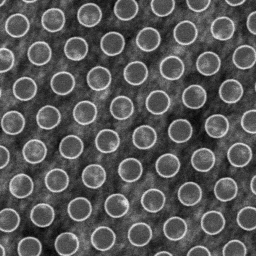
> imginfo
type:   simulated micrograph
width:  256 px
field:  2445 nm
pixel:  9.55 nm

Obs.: a regular array of raised bodies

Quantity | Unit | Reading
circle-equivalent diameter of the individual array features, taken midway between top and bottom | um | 0.22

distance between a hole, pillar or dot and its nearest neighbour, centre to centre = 0.343 micrometres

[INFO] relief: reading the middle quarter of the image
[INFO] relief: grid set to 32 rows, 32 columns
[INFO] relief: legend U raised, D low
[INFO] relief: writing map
DDDDDDDDDDDDDDDDUUUUDDDDUUUUUUDD
DDDDDDDUUUUDDDDUUUUUUDDDUUUUUUDD
UDDDDDUUUUUDDDDUUUUUUDDDDUUUUDDD
UUDDDDUUUUUUDDDUUUUUDDDDDDUUUDDD
UUDDDDUUUUUDDDDDUUUDDDDDDDDDDDDD
UUDDDDUUUUUDDDDDDDDDDDDDDDDDDDDD
UUDDDDDDDDDDDDDDDDDDDDDDDDDDDDUU
DDDDDDDDDDDDDDDDDDDDDDUUUDDDDDUU
DDDDDDDDDDDDDUUUDDDDDUUUUUDDDDUU
DDDDDUDDDDDDUUUUUDDDDUUUUUDDDDUU
DDDUUUUUDDDDUUUDUDDDDUUUUUDDDDDU
DDDUUUUUDDDDUUUUUDDDDUUUUDDDDDDD
DDDUUUUUDDDDUUUUUDDDDDDDDDDDDDDD
DDDUUUUUDDDDDUUDDDDDDDDDDDDDDDDD
DDDDUUUDDDDDDDDDDDDDDDDDDDDUUUUD
DDDDDDDDDDDDDDDDDDDDDDDDDDDUUUUU
DDDDDDDDDDDDDDDDDDUUUUDDDDUUUUUU
DDDDDDDDDUUUUDDDDUUUUUUDDDUUUUUU
UUUDDDDDUUUUUUDDDUUUUUUDDDDUUUUD
UUUUDDDDUUUUUUDDDUUUUUUDDDDDDUDD
UUUUUDDDUUUUUDDDDDUUUUDDDDDDDDDD
UUUUDDDDDUUUDDDDDDDDDDDDDDDDDDDD
UUUUDDDDDDDDDDDDDDDDDDDDDDDDDDDD
DDDDDDDDDDDDDDDDDDDDDDDDUUUUDDDD
DDDDDDDDDDDDDDDUUUUDDDDUUUUUUDDD
DDDDDDUUUDDDDDUUUUUDDDDUUUUUUDDD
DDDDDUUUUUDDDDUUUUUDDDDUUUUUDDDD
DDDDDUUUUUDDDDUUUUUDDDDDUUUUDDDD
UDDDDUUUUUDDDDDUUUUDDDDDDDDDDDDD
UDDDDUUUDUDDDDDDDDDDDDDDDDDDDDDD
UDDDDDUUUDDDDDDDDDDDDDDDDDDDDUUU
DDDDDDDDDDDDDDDDDDDDDUUDDDDDDUUU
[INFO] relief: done